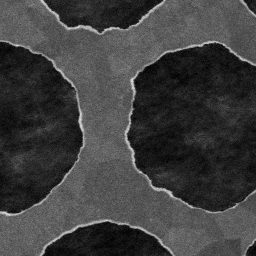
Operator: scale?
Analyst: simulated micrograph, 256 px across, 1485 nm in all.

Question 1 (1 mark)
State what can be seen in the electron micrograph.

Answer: holes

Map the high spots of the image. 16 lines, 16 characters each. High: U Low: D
UUUDDDDDDDUUUUUD
UUUUDDDDUUUUUUUU
UUUUUUUUUUUUUUUU
DDDUUUUUUUDDDDDU
DDDDUUUUUDDDDDDD
DDDDDUUUDDDDDDDD
DDDDDUUUDDDDDDDD
DDDDDUUUDDDDDDDD
DDDDDUUUDDDDDDDD
DDDDDUUUDDDDDDDD
DDDDUUUUUDDDDDDD
DDDDUUUUUUDDDDDD
DDDUUUUUUUUDDDDU
UUUUUUUUUUUUUUUU
UUUUDDDDDUUUUUUU
UUUDDDDDDDUUUUUU